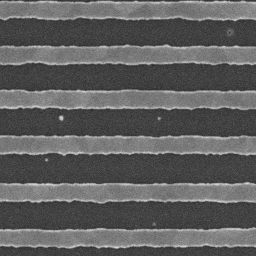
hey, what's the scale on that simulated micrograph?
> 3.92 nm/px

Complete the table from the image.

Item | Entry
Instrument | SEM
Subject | lines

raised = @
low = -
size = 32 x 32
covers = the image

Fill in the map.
@@@@@@@@@@@@@@@@@@@@@@@@@@@@@@@@
@@@@@@@@@@@@@@@@@@@@@@@@@@@@@@@@
--------------------------------
--------------------------------
--------------------------------
--------------------------------
@@@@@@@@@@@@@@@@@@@@@@@@@@@@@@@@
@@@@@@@@@@@@@@@@@@@@@@@@@@@@@@@@
--------------------------------
--------------------------------
--------------------------------
@@@@-@@@@@@@@@@@@@@@@@--@@@@@@@@
@@@@@@@@@@@@@@@@@@@@@@@@@@@@@@@@
@@---@-@@@@@@@@@@@@@@@@@@-@@-@@@
--------------------------------
--------------------------------
--------------------------------
@@@@@@@@@@@@@@@@@@@@@@@@@@@@@@@@
@@@@@@@@@@@@@@@@@@@@@@@@@@@@@@@@
--------------------------------
--------------------------------
--------------------------------
--------------------------------
@@@@@@@@@@@@@@@@@@@@@@@@@@@@@@@@
@@@@@@@@@@@@@@@@@@@@@@@@@@@@@@@@
--------------------------------
--------------------------------
--------------------------------
--------------------------------
@@@@@@@@@@@@@@@@@@@@@@@@@@@@@@@@
@@@@@@@@@@@@@@@@@@@@@@@@@@@@@@@@
--------------------------------